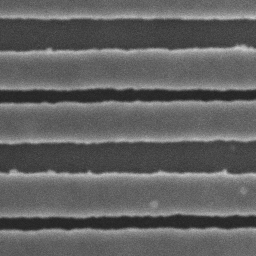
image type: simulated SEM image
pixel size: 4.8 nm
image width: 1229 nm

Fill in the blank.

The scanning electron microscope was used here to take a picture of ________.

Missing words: lines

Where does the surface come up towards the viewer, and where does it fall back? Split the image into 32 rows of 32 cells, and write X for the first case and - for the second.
XXXXXXXXXXXXXXXXXXXXXXXXXXXXXXXX
XXXXXXXXXXXXXXXXXXXXXXXXXXXXXXXX
--------------------------------
--------------------------------
--------------------------------
--------------------------------
XXXXXXXXXXXXXXXXXXXXXXXXXXXXXXXX
XXXXXXXXXXXXXXXXXXXXXXXXXXXXXXXX
XXXXXXXXXXXXXXXXXXXXXXXXXXXXXXXX
XXXXXXXXXXXXXXXXXXXXXXXXXXXXXXXX
XXXXXXXXXXXXXXXXXXXXXXXXXXXXXXXX
--------------------------------
--------------------------------
XXXXXXXXXXXXXXXXXXXXXXXXXXXXXXXX
XXXXXXXXXXXXXXXXXXXXXXXXXXXXXXXX
XXXXXXXXXXXXXXXXXXXXXXXXXXXXXXXX
XXXXXXXXXXXXXXXXXXXXXXXXXXXXXXXX
XXXXXXXXXXXXXXXXXXXXXXXXXXX-XXXX
--------------------------------
--------------------------------
--------------------------------
--------------------------------
XXXXXXXXXXXXXXXXXXXXXXXXXXXXXXXX
XXXXXXXXXXXXXXXXXXXXXXXXXXXXXXXX
XXXXXXXXXXXXXXXXXXXXXXXXXXXXXXXX
XXXXXXXXXXXXXXXXXXXXXXXXXXXXXXXX
XXXXXXXXXXXXXXXXXXXXXXXXXXXXXXXX
--------------------------------
--------------------X-----X---XX
XXXXXXXXXXXXXXXXXXXXXXXXXXXXXXXX
XXXXXXXXXXXXXXXXXXXXXXXXXXXXXXXX
XXXXXXXXXXXXXXXXXXXXXXXXXXXXXXXX